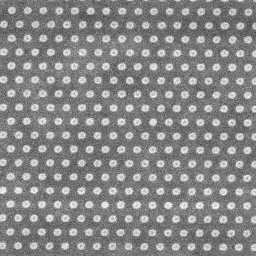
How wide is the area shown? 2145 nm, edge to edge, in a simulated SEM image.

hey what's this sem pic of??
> a regular array of raised bodies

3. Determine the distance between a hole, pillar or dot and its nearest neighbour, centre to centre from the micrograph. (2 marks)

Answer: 15.4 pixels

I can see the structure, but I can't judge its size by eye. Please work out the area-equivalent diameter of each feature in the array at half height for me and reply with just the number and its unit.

55.9 nm